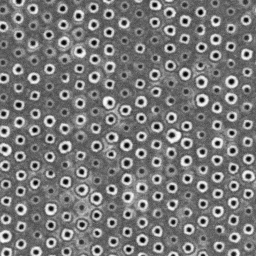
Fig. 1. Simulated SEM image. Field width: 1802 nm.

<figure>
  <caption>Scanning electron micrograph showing a regular array of holes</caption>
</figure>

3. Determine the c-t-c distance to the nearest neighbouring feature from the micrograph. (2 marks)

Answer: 117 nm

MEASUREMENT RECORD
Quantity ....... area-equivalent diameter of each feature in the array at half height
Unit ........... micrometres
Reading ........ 0.0412